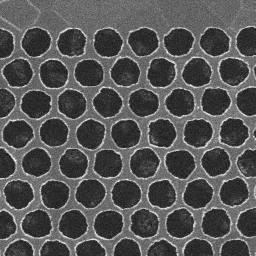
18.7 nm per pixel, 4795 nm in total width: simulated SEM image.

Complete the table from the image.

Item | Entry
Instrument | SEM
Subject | a regular array of holes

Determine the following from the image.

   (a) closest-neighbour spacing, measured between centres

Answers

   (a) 646 nm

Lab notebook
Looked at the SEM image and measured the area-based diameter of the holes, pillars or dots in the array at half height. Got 548 nm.